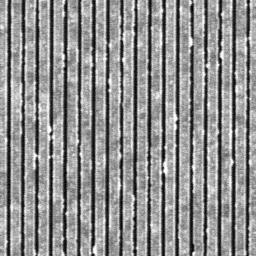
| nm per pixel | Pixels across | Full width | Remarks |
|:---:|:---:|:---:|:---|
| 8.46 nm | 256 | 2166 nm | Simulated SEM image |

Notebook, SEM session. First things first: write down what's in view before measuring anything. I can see parallel lines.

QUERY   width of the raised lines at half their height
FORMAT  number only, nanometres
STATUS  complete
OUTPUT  78.3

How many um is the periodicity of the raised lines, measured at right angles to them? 0.119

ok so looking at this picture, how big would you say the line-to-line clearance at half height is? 39.1 nanometers